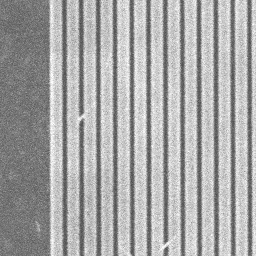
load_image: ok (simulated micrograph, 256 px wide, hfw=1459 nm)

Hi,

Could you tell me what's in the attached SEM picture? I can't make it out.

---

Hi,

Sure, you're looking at parallel lines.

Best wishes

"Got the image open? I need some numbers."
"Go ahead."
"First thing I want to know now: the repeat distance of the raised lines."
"96.1 nanometres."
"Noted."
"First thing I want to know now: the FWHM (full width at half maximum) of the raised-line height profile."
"0.067 um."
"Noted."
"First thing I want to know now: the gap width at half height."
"30.6 nm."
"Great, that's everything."